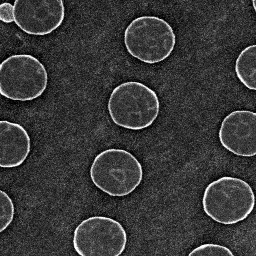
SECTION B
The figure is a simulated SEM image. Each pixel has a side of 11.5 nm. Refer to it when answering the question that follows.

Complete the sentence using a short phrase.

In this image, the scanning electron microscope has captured raised bodies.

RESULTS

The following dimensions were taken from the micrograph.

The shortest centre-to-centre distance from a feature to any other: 790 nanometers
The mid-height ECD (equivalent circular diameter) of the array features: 47.9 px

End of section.